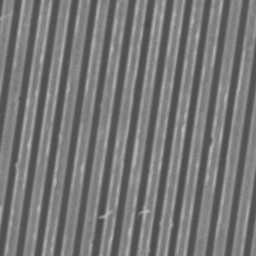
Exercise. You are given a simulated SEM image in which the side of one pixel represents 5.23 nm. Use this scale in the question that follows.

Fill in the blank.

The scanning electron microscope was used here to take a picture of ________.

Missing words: parallel lines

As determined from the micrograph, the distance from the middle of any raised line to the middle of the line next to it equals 0.0982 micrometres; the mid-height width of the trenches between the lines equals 40.7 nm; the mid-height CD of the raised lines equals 57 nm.